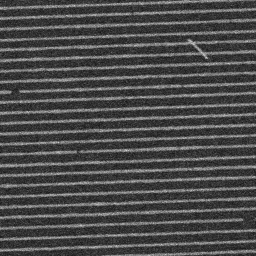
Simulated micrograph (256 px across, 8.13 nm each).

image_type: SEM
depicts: parallel lines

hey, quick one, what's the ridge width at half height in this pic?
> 0.0183 micrometres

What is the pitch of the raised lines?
85.4 nm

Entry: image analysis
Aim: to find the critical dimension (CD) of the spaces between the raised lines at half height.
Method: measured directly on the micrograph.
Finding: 68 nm